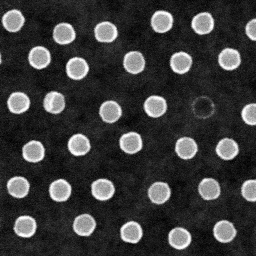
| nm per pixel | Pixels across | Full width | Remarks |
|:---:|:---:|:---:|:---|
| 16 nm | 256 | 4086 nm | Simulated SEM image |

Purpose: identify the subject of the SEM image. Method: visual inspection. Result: a regular array of raised bodies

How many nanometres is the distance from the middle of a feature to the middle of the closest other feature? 656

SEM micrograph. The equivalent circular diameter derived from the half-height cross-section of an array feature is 20.6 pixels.